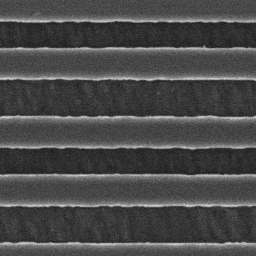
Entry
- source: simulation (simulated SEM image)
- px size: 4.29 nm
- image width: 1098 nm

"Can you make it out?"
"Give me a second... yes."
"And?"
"lines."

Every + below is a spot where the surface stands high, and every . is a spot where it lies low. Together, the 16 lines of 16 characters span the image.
++++++++++++++++
................
................
++++++++++++++++
++++++++++++++++
................
................
++++++++++++++++
++++++++++++++++
................
................
++++++++++++++++
++++++++++++++++
................
................
++++++++++++++++